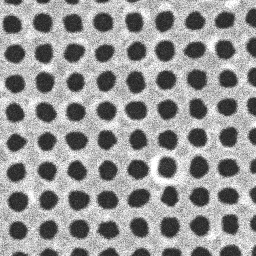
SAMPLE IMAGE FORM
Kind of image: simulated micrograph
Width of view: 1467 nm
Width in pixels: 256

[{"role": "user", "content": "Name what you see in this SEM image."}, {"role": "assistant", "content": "a regular array of holes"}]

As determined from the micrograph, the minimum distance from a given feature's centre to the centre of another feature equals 167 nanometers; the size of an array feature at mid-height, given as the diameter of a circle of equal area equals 113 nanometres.